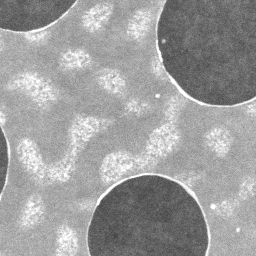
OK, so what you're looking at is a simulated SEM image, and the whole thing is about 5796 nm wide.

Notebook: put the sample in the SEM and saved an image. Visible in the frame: holes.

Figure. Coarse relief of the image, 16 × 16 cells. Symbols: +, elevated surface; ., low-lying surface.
....++++++......
...+++++++......
++++++++++......
++++++++++......
++++++++++......
+++++++++++.....
+++++++++++++..+
++++++++++++++++
++++++++++++++++
.+++++++++++++++
++++++++++++++++
+++++++....+++++
++++++......++++
++++++.......+++
+++++........+++
++++++.......+++